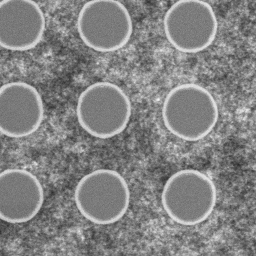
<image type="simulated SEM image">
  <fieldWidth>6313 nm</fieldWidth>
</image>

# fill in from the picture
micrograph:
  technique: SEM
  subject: raised bodies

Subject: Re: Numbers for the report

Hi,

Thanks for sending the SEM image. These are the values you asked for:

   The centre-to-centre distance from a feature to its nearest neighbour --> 2110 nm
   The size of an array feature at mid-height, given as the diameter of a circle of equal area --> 1280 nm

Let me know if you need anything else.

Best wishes